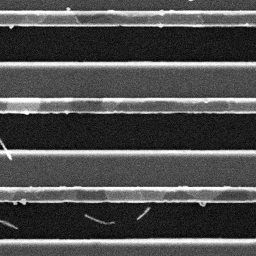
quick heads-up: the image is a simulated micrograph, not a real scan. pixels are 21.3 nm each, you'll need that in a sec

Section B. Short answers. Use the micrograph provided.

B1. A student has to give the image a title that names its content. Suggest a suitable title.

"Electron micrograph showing lines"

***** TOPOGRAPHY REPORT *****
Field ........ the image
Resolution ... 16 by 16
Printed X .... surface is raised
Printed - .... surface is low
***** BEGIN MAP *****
XXXXXXXXXXXXXXXX
XXXXXXXXXXXXXXXX
----------------
----------------
XXXXXXXXXXXXXXXX
XXXXXXXXXXXXXXXX
XXXXXXXXXXXXXXXX
----------------
----------------
X---------X--X--
XXXXXXXXXXXXXXXX
XXXXXXXXXXXXXXXX
XXXXXXXXXXXXXXXX
----------------
----------------
XXXXXXXXXXXXXXXX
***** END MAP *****